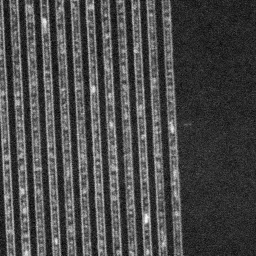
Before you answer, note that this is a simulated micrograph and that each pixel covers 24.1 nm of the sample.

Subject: parallel lines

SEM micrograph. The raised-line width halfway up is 6.86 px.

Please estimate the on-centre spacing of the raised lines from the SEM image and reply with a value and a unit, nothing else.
0.366 µm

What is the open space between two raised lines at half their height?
205 nm